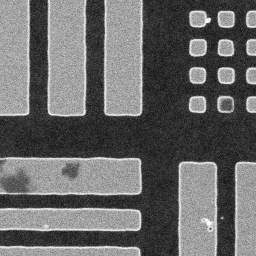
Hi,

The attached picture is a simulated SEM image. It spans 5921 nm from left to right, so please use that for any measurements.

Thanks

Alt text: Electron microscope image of groups of lines, slits or small figures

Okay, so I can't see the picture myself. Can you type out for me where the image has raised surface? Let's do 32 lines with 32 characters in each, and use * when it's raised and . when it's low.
****..*****..*****..............
****..*****..*****......*...*..*
****..*****..*****......**.**..*
****..*****..*****..............
****..*****..*****..............
****..*****..*****......**.**..*
****..*****..*****......**.**..*
****..*****..*****..............
****..*****..*****..............
****..*****..*****......**.**..*
****..*****..*****..............
****..*****..*****..............
****..*****..*****......**.**..*
****..*****..*****......**.**..*
................................
................................
................................
................................
................................
................................
******************.....****...**
******************....*****..***
******************....*****..***
******************....*****...**
......................*****...**
......................*****...**
*****************.....*****...**
******************....*****..***
*****************.....*****..***
......................*****...**
......................*****..***
*****************.....*****..***